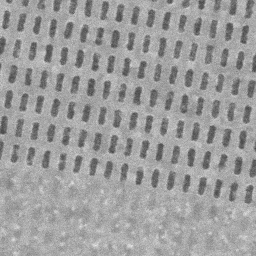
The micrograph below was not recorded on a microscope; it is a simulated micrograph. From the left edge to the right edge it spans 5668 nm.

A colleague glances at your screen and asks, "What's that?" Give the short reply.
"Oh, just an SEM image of a regular array of holes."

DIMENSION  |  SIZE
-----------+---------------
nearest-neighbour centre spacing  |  349 nanometres